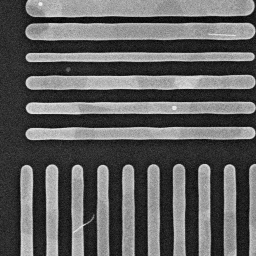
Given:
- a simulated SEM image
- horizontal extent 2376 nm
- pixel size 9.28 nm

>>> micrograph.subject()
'groups of lines, slits or small figures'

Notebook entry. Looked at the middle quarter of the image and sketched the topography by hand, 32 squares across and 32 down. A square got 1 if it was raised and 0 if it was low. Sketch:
00000000000000000000000000000000
00000000000000000000000000000000
00000000000000000000000000000000
11111111111111111111111111111111
11111111111111111111111111111111
11111111111111111111111111111111
00000000000000000000000000000000
00000000000000000000000000000000
00000000000000000000000000000000
00000000000000000000000000000000
11111111111111111111111111111111
11111111111111111111111111111111
00000000000000000000000000000000
00000000000000000000000000000000
00000000000000000000000000000000
00000000000000000000000000000000
11111111111111111111111111111111
11111111111111111111111111111111
11111111111111111111111111111111
00000000000000000000000000000000
00000000000000000000000000000000
00000000000000000000000000000000
00000000000000000000000000000000
00000000000000000000000000000000
00000000000000000000000000000000
00010000010000011000011000001100
00111000111000011000011100011100
00111000111000011000011100011100
00111000011000011000011100011100
00111000111000011000011100011100
00111000111000011000011100011100
00111000111000011000011100011100